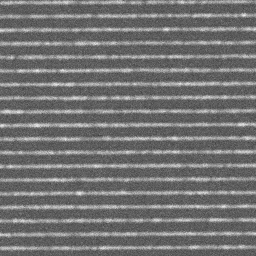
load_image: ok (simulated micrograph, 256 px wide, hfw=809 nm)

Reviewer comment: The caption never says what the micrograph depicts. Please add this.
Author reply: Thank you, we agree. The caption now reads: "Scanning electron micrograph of parallel lines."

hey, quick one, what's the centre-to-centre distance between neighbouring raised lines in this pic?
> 43.1 nm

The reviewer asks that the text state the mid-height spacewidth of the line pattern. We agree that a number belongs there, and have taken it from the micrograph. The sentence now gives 0.0352 µm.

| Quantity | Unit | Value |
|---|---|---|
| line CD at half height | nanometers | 7.9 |